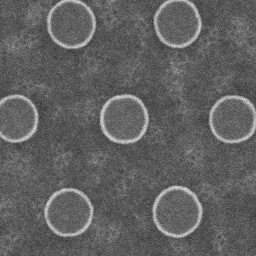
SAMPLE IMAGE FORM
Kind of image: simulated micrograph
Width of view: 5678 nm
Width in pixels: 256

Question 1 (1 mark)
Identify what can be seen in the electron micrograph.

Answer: raised bodies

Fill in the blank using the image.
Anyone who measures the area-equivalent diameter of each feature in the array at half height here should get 1030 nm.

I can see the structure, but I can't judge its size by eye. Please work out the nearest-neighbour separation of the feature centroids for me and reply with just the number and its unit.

108 pixels